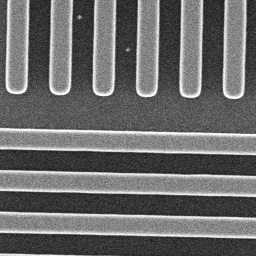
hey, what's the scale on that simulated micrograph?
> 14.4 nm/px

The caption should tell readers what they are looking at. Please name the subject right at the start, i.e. groups of lines, slits or small figures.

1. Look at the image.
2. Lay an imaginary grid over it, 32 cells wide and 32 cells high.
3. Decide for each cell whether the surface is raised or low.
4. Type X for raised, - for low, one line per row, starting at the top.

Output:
-XXX--XXX---XX---XXX---XX---XXX-
-XX---XXX---XX---XXX---XX---XXX-
-XX---XXX---XX---XXX---XX---XXX-
-XX---XXX---XX---XXX---XX---XXX-
-XX---XXX---XX---XXX---XX---XXX-
-XX---XXX---XX---XXX---XX---XXX-
-XX---XXX---XX---XXX---XX---XXX-
-XX---XXX---XX---XXX---XX---XXX-
-XX---XXX---XX---XXX---XX---XX--
-XX---XXX---XX---XXX---XX---XX--
-XX---XXX---XX---XXX---XX---XX--
-XX----X----XX---XX----XX---XX--
--------------------------------
--------------------------------
--------------------------------
--------------------------------
XXXXXXXXXXXXXXX-----------------
XXXXXXXXXXXXXXXXXXXXXXXXXXXXXXXX
XXXXXXXXXXXXXXXXXXXXXXXXXXXXXXXX
--------------------------------
--------------------------------
XXXXXX--------------------------
XXXXXXXXXXXXXXXXXXXXXXXXXXXXXXXX
XXXXXXXXXXXXXXXXXXXXXXXXXXXXXXXX
-------------------------------X
--------------------------------
--------------------------------
XXXXXXXXXXXXXXXXXXXXXXXXXXXXXXXX
XXXXXXXXXXXXXXXXXXXXXXXXXXXXXXXX
---------------------XXXXXXXXXXX
--------------------------------
--------------------------------